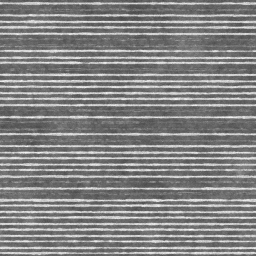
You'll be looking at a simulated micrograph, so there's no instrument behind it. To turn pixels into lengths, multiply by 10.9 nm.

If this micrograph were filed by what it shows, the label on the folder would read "parallel lines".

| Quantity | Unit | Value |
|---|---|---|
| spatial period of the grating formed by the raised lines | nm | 65.1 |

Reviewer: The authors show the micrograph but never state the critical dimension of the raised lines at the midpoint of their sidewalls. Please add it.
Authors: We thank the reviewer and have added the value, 0.0151 um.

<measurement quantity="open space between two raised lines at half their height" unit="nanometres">50.6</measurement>